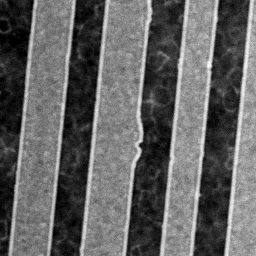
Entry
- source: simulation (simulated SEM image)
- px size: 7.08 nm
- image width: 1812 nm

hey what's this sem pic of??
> one or a few lines or trenches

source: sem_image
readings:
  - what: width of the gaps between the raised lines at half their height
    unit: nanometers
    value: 248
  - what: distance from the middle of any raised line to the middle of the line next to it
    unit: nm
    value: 519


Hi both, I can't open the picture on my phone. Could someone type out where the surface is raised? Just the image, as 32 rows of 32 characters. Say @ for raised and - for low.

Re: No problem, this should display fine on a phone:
----@@@@@----@@@@@@----@@@@----@
----@@@@@----@@@@@@----@@@@----@
----@@@@@----@@@@@@----@@@@----@
----@@@@@----@@@@@-----@@@@----@
----@@@@@----@@@@@-----@@@@----@
----@@@@@----@@@@@-----@@@@----@
----@@@@@----@@@@@-----@@@-----@
----@@@@-----@@@@@-----@@@-----@
----@@@@-----@@@@@----@@@@-----@
---@@@@@----@@@@@@----@@@@-----@
---@@@@@----@@@@@@----@@@@----@@
---@@@@@----@@@@@@----@@@@----@@
---@@@@@----@@@@@-----@@@@----@@
---@@@@@----@@@@@-----@@@@----@@
---@@@@@----@@@@@-----@@@@----@@
---@@@@@----@@@@@@----@@@@----@@
---@@@@@----@@@@@@----@@@-----@@
---@@@@@----@@@@@@----@@@-----@@
---@@@@-----@@@@@-----@@@-----@@
---@@@@----@@@@@@----@@@@----@@@
--@@@@@----@@@@@@----@@@@----@@@
--@@@@@----@@@@@@----@@@@----@@@
--@@@@@----@@@@@-----@@@@----@@@
--@@@@@----@@@@@-----@@@@----@@@
--@@@@@----@@@@@-----@@@@----@@@
--@@@@@----@@@@@-----@@@@----@@@
--@@@@@----@@@@@-----@@@-----@@@
--@@@@@----@@@@@-----@@@-----@@@
--@@@@-----@@@@@-----@@@-----@@@
-@@@@@----@@@@@@----@@@@----@@@@
-@@@@@----@@@@@@----@@@@----@@@@
-@@@@@----@@@@@@----@@@@----@@@@